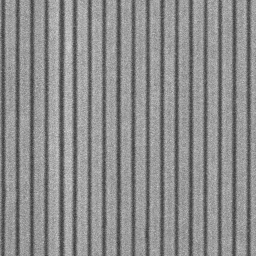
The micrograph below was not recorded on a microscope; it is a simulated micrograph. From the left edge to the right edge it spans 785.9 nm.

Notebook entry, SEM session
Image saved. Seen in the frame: parallel lines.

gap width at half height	14.9	nm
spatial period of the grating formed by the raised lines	44.2	nm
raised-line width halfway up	30.3	nanometres